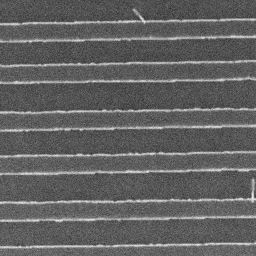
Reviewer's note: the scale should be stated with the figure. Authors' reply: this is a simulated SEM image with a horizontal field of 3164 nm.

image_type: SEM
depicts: lines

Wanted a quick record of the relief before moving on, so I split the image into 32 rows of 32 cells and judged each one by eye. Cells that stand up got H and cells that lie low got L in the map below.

LLLLLLLLLLLLLLLLLLLLLLLLLLLLLLLL
LLLLLLLLLLLLLLLLLLLLLLLLLLLLLLLL
LLLLLLLLLLLLLLLLLLLLLLLLLLLHHHHH
HHHHHHHHHHHHHHHHHHHHHHHHHHHHHHHH
HHHHHHHHHHHHHHHHHHHHHHHHHHHHHHHH
LLLLLLLLLLLLLLLLLLLLLLLLLLLLLLLL
LLLLLLLLLLLLLLLLLLLLLLLLLLLLLLLL
LLLLLLLLLLLLLLLLLLLLLLLLLLLLLLLL
HHHHHHHHHHHHHHHHHHHHHHHHHHHHHHHH
HHHHHHHHHHHHHHHHHHHHHHHHHHHHHHHH
LLLLLLLLLLLLLLLLLLLLLLLLLLLLLLLL
LLLLLLLLLLLLLLLLLLLLLLLLLLLLLLLL
LLLLLLLLLLLLLLLLLLLLLLLLLLLLLLLL
LLLLLLLLLLLLLLLLLLLLLLLLLLLLLLLL
HHHHHHHHHHHHHHHHHHHHHHHHHHHHHHHH
HHHHHHHHHHHHHHHHHHHHHHHHHHHHHHHH
LLLLLLLLLLLLLLLLLLLLLLLLLLLLLLLL
LLLLLLLLLLLLLLLLLLLLLLLLLLLLLLLL
LLLLLLLLLLLLLLLLLLLLLLLLLLLLLLLL
LHHHHHHHHHHHHHHHHHHHHHHHHHHHHHHH
HHHHHHHHHHHHHHHHHHHHHHHHHHHHHHHH
HHHHHHHHHHHHHHHHHHHLLLLLLLLLLLLL
LLLLLLLLLLLLLLLLLLLLLLLLLLLLLLLL
LLLLLLLLLLLLLLLLLLLLLLLLLLLLLLLL
LLLLLLLLLLLLLLLLLLLLLLLLLLLLLLLL
HHHHHHHHHHHHHHHHHHHHHHHHHHHHHHHH
HHHHHHHHHHHHHHHHHHHHHHHHHHHHHHHH
HHHHHLLLLLLLLLLLLLLLLLLLLLLLLLLL
LLLLLLLLLLLLLLLLLLLLLLLLLLLLLLLL
LLLLLLLLLLLLLLLLLLLLLLLLLLLLLLLL
LLLLLLLLLLLLLLLLLLLLLLLLLHHHHHHH
HHHHHHHHHHHHHHHHHHHHHHHHHHHHHHHH